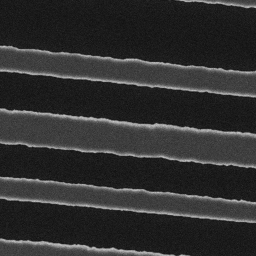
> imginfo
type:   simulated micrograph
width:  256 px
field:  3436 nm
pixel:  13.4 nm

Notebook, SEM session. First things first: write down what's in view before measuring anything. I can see lines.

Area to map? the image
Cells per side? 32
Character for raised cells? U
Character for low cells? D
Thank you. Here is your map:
DDDDDDDDDDDDDDDDDDDDDDDDDDDUUUUU
DDDDDDDDDDDDDDDDDDDDDDDDDDDDDDDD
DDDDDDDDDDDDDDDDDDDDDDDDDDDDDDDD
DDDDDDDDDDDDDDDDDDDDDDDDDDDDDDDD
DDDDDDDDDDDDDDDDDDDDDDDDDDDDDDDD
DDDDDDDDDDDDDDDDDDDDDDDDDDDDDDDD
UUUUUUDDDDDDDDDDDDDDDDDDDDDDDDDD
UUUUUUUUUUUUUUUUUUDDDDDDDDDDDDDD
UUUUUUUUUUUUUUUUUUUUUUUUUUDDDDDD
DDDDDDUUUUUUUUUUUUUUUUUUUUUUUUUU
DDDDDDDDDDDDDDDDDUUUUUUUUUUUUUUU
DDDDDDDDDDDDDDDDDDDDDDDDDDUUUUUU
DDDDDDDDDDDDDDDDDDDDDDDDDDDDDDDD
DDDDDDDDDDDDDDDDDDDDDDDDDDDDDDDD
UUUUUUUUUDDDDDDDDDDDDDDDDDDDDDDD
UUUUUUUUUUUUUUUUUUDDDDDDDDDDDDDD
UUUUUUUUUUUUUUUUUUUUUUUUUUUUDDDD
UUUUUUUUUUUUUUUUUUUUUUUUUUUUUUUU
DDDDDDUUUUUUUUUUUUUUUUUUUUUUUUUU
DDDDDDDDDDDDDDDDUUUUUUUUUUUUUUUU
DDDDDDDDDDDDDDDDDDDDDDDDDDDUUUUU
DDDDDDDDDDDDDDDDDDDDDDDDDDDDDDDD
UUUUUDDDDDDDDDDDDDDDDDDDDDDDDDDD
UUUUUUUUUUUUUUDDDDDDDDDDDDDDDDDD
UUUUUUUUUUUUUUUUUUUUUUUUUDDDDDDD
DDDDDDDUUUUUUUUUUUUUUUUUUUUUUUUU
DDDDDDDDDDDDDDDDDDUUUUUUUUUUUUUU
DDDDDDDDDDDDDDDDDDDDDDDDDDDDUUUU
DDDDDDDDDDDDDDDDDDDDDDDDDDDDDDDD
DDDDDDDDDDDDDDDDDDDDDDDDDDDDDDDD
UUUUUUUDDDDDDDDDDDDDDDDDDDDDDDDD
UUUUUUUUUUUUUUUUUUUDDDDDDDDDDDDD